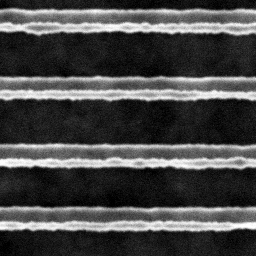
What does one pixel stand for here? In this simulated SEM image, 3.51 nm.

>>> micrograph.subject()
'lines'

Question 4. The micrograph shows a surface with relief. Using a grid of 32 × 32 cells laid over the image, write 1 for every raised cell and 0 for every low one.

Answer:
00000000000000000000000000000000
11111111111111111111111111111111
11111111111111111111111111111111
11111111111111111111111111111111
00000000000000000000000000000000
00000000000000000000000000000000
00000000000000000000000000000000
00000000000000000000000000000000
00000000000000000000000000000000
00000000000000000000000000000000
11111111111111111111111111111111
11111111111111111111111111111111
00000000000000000000000000000000
00000000000000000000000000000000
00000000000000000000000000000000
00000000000000000000000000000000
00000000000000000000000000000000
00000000000000000000000000000000
11111111111111111111111111111111
11111111111111111111111111111111
11111111111111111111111111111111
00000000000000000000000000000000
00000000000000000000000000000000
00000000000000000000000000000000
00000000000000000000000000000000
00000000000000000000000000000000
11111111111111111111111111111111
11111111111111111111111111111111
11111111111111111111111111111101
00000000000000000000000000000000
00000000000000000000000000000000
00000000000000000000000000000000